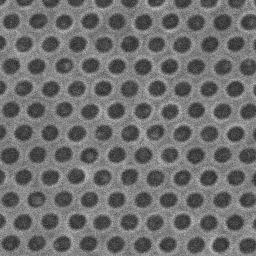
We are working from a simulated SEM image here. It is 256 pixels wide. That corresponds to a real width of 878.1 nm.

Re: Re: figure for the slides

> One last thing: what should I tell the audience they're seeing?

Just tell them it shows a regular array of holes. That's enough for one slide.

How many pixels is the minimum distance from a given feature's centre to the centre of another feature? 25.1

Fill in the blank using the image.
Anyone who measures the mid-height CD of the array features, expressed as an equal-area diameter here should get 62.2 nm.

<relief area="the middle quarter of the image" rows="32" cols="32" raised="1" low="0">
00010000011000001100001100000110
00110000011000011100001100001110
01111101111100111100011110011111
11111111111111111111111111111111
11000111000011100011110001111001
10000111000011000001100000110000
10000010000011000001100000100000
10000111000111000011100001110001
11111111111111110111111111111111
01111111111111111111111111111111
00111000111000011100001110001110
00110000011000001000001100000110
00110000011000011000001100000110
01111000111000111100011110001111
11111111111111111111111111111111
11000111000011100011100001111001
10000111000011000001100001110000
10000010000011000001000001100000
10000111000011000001100011100000
11001111111111100111111111110011
01111111111111111111111111111111
00111000111100011100001110001110
00110000011000001100001100000110
00110000111000011000001100000100
01110000111000011100011110001110
11111111111111111111111111111111
11000111100111100011110011111001
10000111000011000001100001110000
10000110000011000001100001100000
10000110000011000011100001100001
11111111001111111111100011111011
11111111111111111111111111111111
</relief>